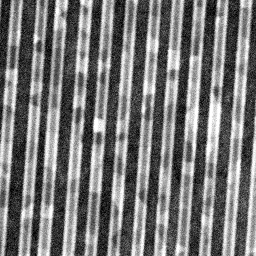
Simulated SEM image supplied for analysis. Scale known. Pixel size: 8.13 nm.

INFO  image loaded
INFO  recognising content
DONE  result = parallel lines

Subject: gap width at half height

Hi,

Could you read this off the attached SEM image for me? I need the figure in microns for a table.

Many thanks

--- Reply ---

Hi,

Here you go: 0.12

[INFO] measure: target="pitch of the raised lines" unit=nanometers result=185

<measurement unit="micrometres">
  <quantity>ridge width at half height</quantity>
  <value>0.0709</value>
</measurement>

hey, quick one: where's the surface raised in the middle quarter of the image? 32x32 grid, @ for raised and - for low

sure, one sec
---@@----@@----@@----@@---@@----
---@@----@@----@@----@@---@@----
---@@----@@----@-----@@---@@----
---@@----@@----@@----@----@@----
---@@----@@----@@---@@----@@----
---@@----@@---@@----@@----@@---@
---@@----@----@@----@@----@@---@
---@@---@@----@@----@@----@@---@
---@@---@@----@@----@@----@@---@
---@@---@@----@@----@@----@@---@
---@@---@@----@@----@@----@@---@
---@@---@@----@@----@@----@@---@
---@@---@@----@@----@@----@----@
---@@---@@----@@----@@---@@----@
--@@----@@----@@----@@---@@----@
--@@----@@----@@----@@---@@----@
--@@----@@----@@----@@---@@----@
--@@----@@----@@---@@----@@----@
--@@----@@----@@---@@----@@----@
--@@----@@---@@----@@----@@---@@
--@@---@@----@@----@@----@@---@@
--@@---@@----@@----@@----@@---@@
--@@---@@----@@----@@----@@---@@
--@@---@@----@@----@@----@@---@@
--@@---@@----@@----@@----@@---@@
--@@---@@----@@----@@----@@---@@
--@@---@@----@@----@@----@@---@@
--@@---@@----@@----@@---@@----@@
-@@----@@----@@----@@---@@----@@
-@@----@@----@@----@@---@@----@@
-@@----@@----@@----@@---@@----@@
-@@----@@----@@---@@----@@----@@